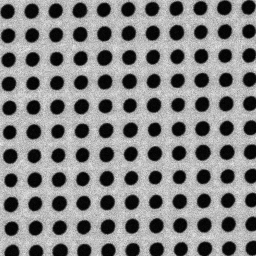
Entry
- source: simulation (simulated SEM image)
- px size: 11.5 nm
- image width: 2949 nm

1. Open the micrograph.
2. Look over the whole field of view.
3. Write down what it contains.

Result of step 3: a regular array of holes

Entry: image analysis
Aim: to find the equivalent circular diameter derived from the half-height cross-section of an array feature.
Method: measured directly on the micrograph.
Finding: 169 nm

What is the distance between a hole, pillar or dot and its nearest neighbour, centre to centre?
0.276 micrometres